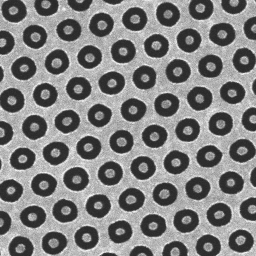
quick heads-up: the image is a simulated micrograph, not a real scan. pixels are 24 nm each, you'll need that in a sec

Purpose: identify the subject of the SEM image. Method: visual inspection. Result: a regular array of ring-shaped grooves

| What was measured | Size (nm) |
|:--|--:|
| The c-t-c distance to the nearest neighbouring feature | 792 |